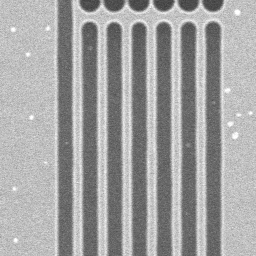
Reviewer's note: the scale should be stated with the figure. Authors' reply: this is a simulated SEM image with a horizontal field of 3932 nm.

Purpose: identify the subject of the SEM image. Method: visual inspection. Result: groups of lines, slits or small figures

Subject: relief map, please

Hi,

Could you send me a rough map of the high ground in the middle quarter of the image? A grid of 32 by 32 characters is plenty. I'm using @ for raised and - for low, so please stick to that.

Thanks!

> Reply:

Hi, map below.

--@@-----@@----@@----@@----@@---
--@@-----@@----@@----@@----@@---
--@@-----@@----@@----@@----@@---
--@@-----@@----@@----@@----@@---
--@@-----@@----@@----@@----@@---
--@@-----@@----@@----@@----@@---
--@@-----@@----@@----@@----@@---
--@@-----@@----@@----@@----@@---
--@@-----@@----@@----@@----@@---
--@@-----@@----@@----@@----@@---
--@@-----@@----@@----@@----@@---
--@@-----@@----@@----@@----@@---
--@@-----@@----@@----@@----@@---
--@@-----@@----@@----@@----@@---
--@@-----@@----@@----@@----@@---
--@@-----@@----@@----@@----@@---
--@@-----@@----@@----@@----@@---
--@@-----@@----@@----@@----@@---
--@@-----@@----@@----@@----@@---
--@@-----@@----@@----@@----@@---
--@@-----@@----@@----@@----@@---
--@@-----@@----@@----@@----@@---
--@@-----@@----@@----@@----@@---
--@@-----@@----@@----@@----@@---
--@@-----@@----@@----@@----@@---
--@@-----@@----@@----@@----@@---
--@@-----@@----@@----@@----@@---
--@@-----@@----@@----@@----@@---
--@@-----@@----@@----@@----@@---
--@@-----@@----@@----@@----@@---
--@@-----@@----@@----@@----@@---
--@@-----@@----@@----@@----@@---